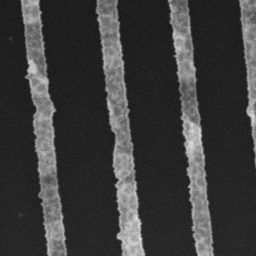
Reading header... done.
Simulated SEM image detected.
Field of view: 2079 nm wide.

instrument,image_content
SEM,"one or a few lines or trenches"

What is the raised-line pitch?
599 nm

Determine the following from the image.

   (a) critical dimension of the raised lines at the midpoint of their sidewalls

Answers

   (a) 16.8 px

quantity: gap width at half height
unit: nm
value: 446